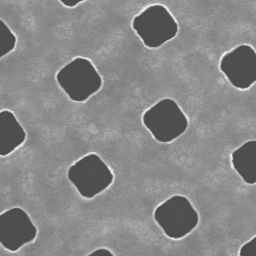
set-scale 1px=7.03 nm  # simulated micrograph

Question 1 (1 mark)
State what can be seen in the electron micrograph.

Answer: holes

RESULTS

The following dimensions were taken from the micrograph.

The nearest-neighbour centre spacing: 655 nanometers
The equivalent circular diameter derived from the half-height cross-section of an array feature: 282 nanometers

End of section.